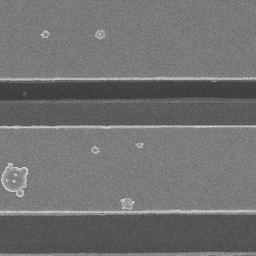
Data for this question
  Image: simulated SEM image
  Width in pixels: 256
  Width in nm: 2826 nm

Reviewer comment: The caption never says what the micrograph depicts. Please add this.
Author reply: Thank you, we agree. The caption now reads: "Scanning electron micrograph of lines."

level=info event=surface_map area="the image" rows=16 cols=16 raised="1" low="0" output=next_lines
1111111111111111
1111111111111111
1111111111111111
1111111111111111
1111111111111111
0000000000000000
0000000000000000
0000000000000000
1111111111111111
1111111111111111
1111111111111111
1111111111111111
1111111111111111
0000000000000000
0000000000000000
0000000000000000